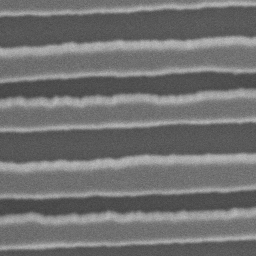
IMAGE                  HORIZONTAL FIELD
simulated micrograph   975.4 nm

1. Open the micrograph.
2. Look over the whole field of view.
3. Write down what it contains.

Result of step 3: lines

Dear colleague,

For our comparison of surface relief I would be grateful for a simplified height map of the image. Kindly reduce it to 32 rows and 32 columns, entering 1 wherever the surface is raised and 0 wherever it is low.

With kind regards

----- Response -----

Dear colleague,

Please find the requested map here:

11111111111111111111111111111111
11111111111111110000000000000000
00000000000000000000000000000000
00000000000000000000000000000000
00000000000000000000000000000000
00000000000000111111111111111111
11111111111111111111111111111111
11111111111111111111111111111111
11111111111111111111111111111111
11111111111000000000000000000000
00000000000000000000000000000000
00000000000000000000000000000111
00100101101111111111111111111111
11111111111111111111111111111111
11111111111111111111111111111111
11111111111111111111100000000000
00000000000000000000000000000000
00000000000000000000000000000000
00000000000000000000000000000000
00000000000000000000000000000010
00000111111111111111111111111111
11111111111111111111111111111111
11111111111111111111111111111111
11111111111111111111111111111111
11111111111000000000000000000000
00000000000000000000000000000000
00000000000000000000000000000111
11111111111111111111111111111111
11111111111111111111111111111111
11111111111111111111111111111111
11111111111111111000000000000000
00000000000000000000000000000000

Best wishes